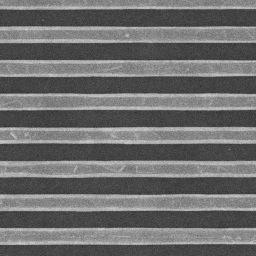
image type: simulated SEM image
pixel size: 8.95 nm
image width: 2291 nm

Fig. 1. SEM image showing wiring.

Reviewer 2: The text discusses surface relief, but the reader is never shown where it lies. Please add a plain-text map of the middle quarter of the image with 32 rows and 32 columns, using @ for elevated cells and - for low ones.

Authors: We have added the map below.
@@@@@@@@@@@@@@@@@@@@@@@@@@@@@@@@
@@@@@@@@@@@@@@@@@@@@@@@@@@@@@@@@
@@@@@@@@@@@@@@@@@@@@@@@@@@@@@@@@
--------------------------------
--------------------------------
--------------------------------
--------------------------------
--------------------------------
@@@@@@@@@@@@@@@@@@@@@@@@@@@@@@@@
@@@@@@@@@@@@@@@@@@@@@@@@@@@@@@@@
@@@@@@@@@@@@@@@@@@@@@@@@@@@@@@@@
--------------------------------
--------------------------------
--------------------------------
--------------------------------
--------------------------------
@@@@@@@@@@@@@@@@@@@@@@@@@@@@@@@@
@@@@@@@@@@@@@@@@@@@@@@@@@@@@@@@@
@@@@@@@@@@@@@@@@@@@@@@@@@@@@@@@@
--------------------------------
--------------------------------
--------------------------------
--------------------------------
--------------------------------
--------------------------------
@@@@@@@@@@@@@@@@@@@@@@@@@@@@@@@@
@@@@@@@@@@@@@@@@@@@@@@@@@@@@@@@@
@@@@@@@@@@@@@@@@@@@@@@@@@@@@@@@@
--------------------------------
--------------------------------
--------------------------------
--------------------------------